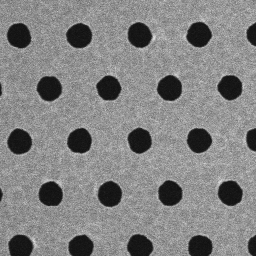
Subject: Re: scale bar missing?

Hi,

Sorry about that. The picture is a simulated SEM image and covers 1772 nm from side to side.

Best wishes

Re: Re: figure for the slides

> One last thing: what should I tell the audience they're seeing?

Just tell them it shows a regular array of holes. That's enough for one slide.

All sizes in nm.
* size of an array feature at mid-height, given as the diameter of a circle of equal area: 170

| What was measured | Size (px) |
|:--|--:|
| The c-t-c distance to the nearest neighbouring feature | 59.8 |